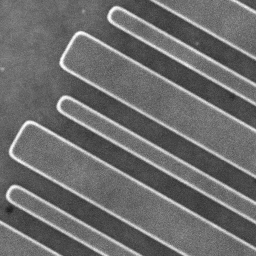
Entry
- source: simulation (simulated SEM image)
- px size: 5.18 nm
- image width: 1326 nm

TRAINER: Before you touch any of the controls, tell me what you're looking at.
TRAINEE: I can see groups of lines, slits or small figures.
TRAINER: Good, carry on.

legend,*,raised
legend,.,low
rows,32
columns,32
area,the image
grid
....................**********..
..............**......**********
..............****.....*********
...............*****.....*******
.........**......****......*****
.........****......****......***
........*******.....*****.....**
........********......****......
........**********......****....
..........**********......****..
...........***********.....*****
.............***********.....***
........*......**********......*
.......****......**********.....
........*****.....***********...
...**.....*****.....***********.
..****......****......**********
..******......****......********
.*********.....*****.....*******
..**********.....*****.....*****
...**********......****......***
.....**********......****......*
......***********.....*****.....
.**.....***********.....*****...
.***......**********......****..
..****......**********......****
...*****.....***********.....***
.....*****.....***********.....*
*......****......**********.....
***......****......**********...
*****......****......**********.
*******.....*****.....**********